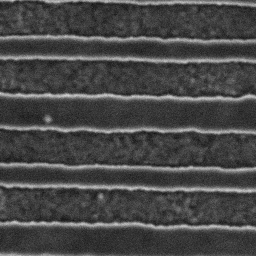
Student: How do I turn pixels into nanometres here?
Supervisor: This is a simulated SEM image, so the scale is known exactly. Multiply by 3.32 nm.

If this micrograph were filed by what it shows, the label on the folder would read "lines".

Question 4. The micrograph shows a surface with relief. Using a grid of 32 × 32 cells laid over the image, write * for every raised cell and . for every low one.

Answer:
.................*****.....*****
................................
................................
................................
........*.......................
********************************
********************************
...............*.***************
................................
................................
................................
................................
********************************
********************************
********************************
********************************
.............*......*....*******
................................
................................
................................
******..........................
********************************
********************************
..........**********************
................................
................................
................................
................................
********************************
********************************
********************************
********************************